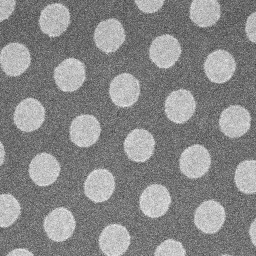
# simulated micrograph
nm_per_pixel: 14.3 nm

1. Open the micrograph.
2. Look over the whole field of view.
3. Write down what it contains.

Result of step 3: a regular array of raised bodies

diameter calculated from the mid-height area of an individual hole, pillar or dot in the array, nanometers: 439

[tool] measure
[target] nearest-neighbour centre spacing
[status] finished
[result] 806 nm